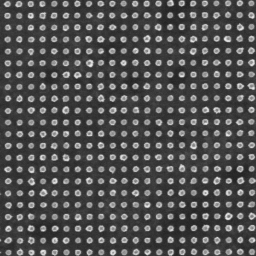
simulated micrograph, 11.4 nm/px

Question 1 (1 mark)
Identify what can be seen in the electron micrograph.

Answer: a regular array of raised bodies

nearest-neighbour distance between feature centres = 130 nanometers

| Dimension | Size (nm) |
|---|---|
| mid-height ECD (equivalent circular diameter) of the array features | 66.7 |